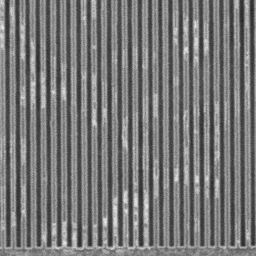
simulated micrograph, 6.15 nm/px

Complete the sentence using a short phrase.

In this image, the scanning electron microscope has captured parallel lines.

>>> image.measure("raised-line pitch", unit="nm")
62.7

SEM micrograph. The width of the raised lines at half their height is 27.7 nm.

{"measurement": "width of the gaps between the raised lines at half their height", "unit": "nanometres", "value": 33.8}